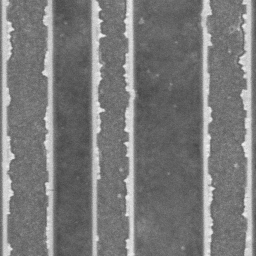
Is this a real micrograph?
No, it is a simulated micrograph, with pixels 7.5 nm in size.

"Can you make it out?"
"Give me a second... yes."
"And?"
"one or a few lines or trenches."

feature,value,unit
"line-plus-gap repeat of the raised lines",750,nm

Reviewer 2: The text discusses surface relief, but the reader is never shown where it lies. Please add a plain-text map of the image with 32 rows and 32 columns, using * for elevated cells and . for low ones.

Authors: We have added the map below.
******......****..........*****.
******......****..........*****.
******......****.........******.
.*****......****..........*****.
.*****......****..........*****.
.*****......****..........*****.
.*****......****..........*****.
.*****......****..........*****.
.*****......****..........*****.
.*****......****..........*****.
.*****......****..........*****.
.*****......*****.........*****.
.*****......*****.........*****.
.*****......****..........*****.
.*****......****..........*****.
.*****......****..........*****.
.*****......****..........*****.
.*****......****..........*****.
.*****......****..........*****.
.*****......****..........*****.
.*****......****..........*****.
.*****......****..........*****.
.*****......****..........*****.
.*****......****..........*****.
.*****......****..........*****.
.*****......****..........*****.
.*****......****..........*****.
.*****......****..........*****.
.*****......****..........*****.
.*****......****..........*****.
.*****......****..........*****.
.*****......*****.........*****.